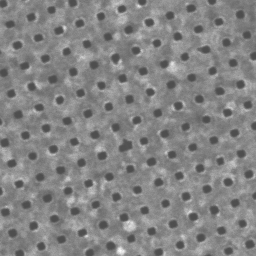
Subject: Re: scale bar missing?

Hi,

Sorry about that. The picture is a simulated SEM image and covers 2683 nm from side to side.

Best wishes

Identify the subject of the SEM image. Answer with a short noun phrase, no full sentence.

a regular array of holes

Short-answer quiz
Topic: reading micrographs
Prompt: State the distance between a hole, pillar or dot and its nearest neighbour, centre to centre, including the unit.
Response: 228 nanometres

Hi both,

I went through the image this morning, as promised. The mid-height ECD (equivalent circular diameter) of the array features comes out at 92.3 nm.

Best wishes